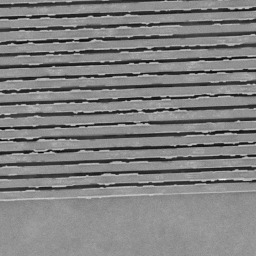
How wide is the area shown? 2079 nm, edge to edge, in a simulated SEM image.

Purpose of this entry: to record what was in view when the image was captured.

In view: parallel lines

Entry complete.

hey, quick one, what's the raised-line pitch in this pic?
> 99.5 nanometers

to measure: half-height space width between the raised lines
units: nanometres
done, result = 27.4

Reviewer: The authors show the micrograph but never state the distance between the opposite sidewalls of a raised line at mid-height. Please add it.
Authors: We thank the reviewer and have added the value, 0.0751 microns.